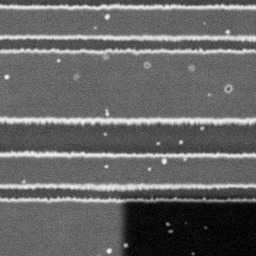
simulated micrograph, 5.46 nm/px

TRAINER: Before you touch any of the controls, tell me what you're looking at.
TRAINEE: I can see lines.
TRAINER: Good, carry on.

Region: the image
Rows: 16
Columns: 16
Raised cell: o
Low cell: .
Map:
oooooooooooooooo
oooooooooooooooo
oooooooooooooooo
oooooooooooooooo
oooooooooooooooo
oooooooooooooooo
oooooooooooooooo
oooooooooooooooo
................
................
oooooooooooooooo
oooooooooooooooo
oooooooooooooooo
oooooooooooooooo
oooooooooooooooo
oooooooooooooooo